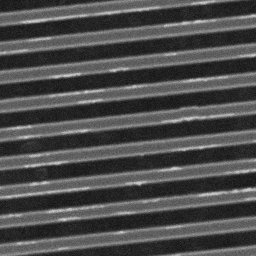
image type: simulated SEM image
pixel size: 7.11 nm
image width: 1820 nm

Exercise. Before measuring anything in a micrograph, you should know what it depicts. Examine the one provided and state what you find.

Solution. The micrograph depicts parallel lines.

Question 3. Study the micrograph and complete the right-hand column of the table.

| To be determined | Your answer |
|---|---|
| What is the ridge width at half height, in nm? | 87.6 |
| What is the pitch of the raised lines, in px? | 28.7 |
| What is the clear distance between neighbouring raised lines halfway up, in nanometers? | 121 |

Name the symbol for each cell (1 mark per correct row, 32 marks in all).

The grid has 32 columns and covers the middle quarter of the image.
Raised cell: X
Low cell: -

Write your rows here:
XXXXXXXXXXXXXXXXXXXXXXX---------
XXXXXXXXXXXXXX-X----------------
XXXXX---------------------------
--------------------------------
----------------------------XXXX
-----------------XXXXXXXXXXXXXXX
---------XXXXXXXXXXXXXXXXXXXXXXX
XXXXXXXXXXXXXXXXXXXXXXXXXX------
XXXXXXXXXXXXXXX-X---------------
XXXXXXXX------------------------
--------------------------------
-----------------------------XXX
--------------------XXXXXXXXXXXX
----------XXXXXXXXXXXXXXXXXXXXXX
-XXXXXXXXXXXXXXXXXXXXXXXXXXX----
XXXXXXXXXXXXXXXXXXX-------------
XXXXXXXXX-----------------------
--------------------------------
------------------------------XX
---------------------XXXXXXXXXXX
-----------XXXXXXXXXXXXXXXXXXXXX
--XXXXXXXXXXXXXXXXXXXXXXXXXXXXX-
XXXXXXXXXXXXXXXXXXXX------------
XXXXXXXXXXX---------------------
XX------------------------------
--------------------------------
------------------------XXXXXXXX
---------------XXXXXXXXXXXXXXXXX
------XXXXXXXXXXXXXXXXXXXXXXXXXX
XXXXXXXXXXXXXXXXXXXXXXX---------
XXXXXXXXXXXX-X------------------
XXX-X---------------------------